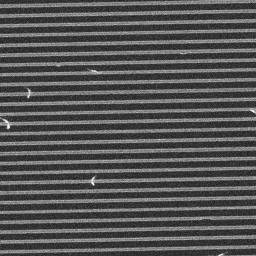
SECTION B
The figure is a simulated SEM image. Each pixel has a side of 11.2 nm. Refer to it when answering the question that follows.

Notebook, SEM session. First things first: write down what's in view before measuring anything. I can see parallel lines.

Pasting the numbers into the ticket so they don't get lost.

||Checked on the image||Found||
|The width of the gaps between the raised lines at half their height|77.4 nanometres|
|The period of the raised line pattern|0.111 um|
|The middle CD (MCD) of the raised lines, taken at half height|33.8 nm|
